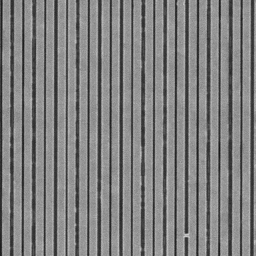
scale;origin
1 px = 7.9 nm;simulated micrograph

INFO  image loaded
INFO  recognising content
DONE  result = parallel lines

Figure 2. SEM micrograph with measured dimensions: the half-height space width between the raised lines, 33.6 nanometers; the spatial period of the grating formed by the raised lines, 86.3 nm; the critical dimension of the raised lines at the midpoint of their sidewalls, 7.75 pixels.